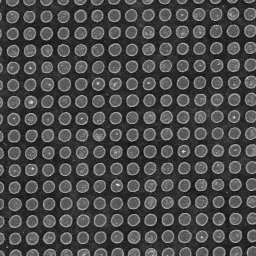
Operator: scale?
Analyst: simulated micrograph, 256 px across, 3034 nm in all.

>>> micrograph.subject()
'a regular array of raised bodies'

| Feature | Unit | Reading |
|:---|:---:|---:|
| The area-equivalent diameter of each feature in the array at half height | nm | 148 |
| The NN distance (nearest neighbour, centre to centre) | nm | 198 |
